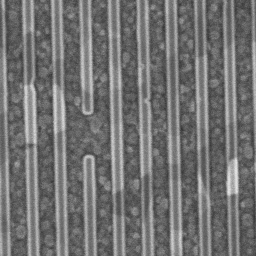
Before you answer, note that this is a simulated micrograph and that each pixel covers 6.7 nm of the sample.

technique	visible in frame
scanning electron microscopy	parallel lines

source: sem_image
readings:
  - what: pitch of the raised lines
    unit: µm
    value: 0.192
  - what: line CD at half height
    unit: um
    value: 0.0544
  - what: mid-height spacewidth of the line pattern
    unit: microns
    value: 0.139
